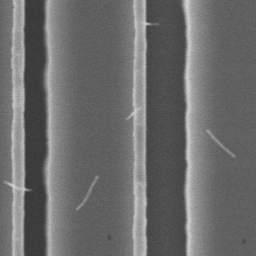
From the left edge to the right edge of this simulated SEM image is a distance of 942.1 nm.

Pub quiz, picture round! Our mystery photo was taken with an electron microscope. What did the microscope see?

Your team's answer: lines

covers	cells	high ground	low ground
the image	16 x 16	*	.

*..******...****
*..******...****
*..******...****
*..******...****
*..******...****
*..******...****
*..******...****
*..******...****
*..******...****
*..******...****
*..******...****
**.******...****
*..******...****
*..******...****
*..******...****
*..******...****